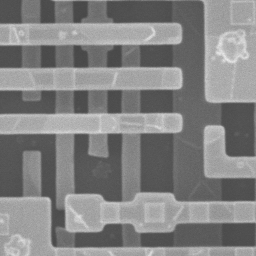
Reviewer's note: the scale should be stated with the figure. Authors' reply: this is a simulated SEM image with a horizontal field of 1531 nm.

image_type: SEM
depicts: wiring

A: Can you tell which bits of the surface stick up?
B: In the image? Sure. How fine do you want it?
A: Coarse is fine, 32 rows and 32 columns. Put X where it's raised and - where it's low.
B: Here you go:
-------------------------XXXXXXX
--------------------------XXXXXX
--------------------------XXXXXX
XXXXXXXXXXXXXXXXXXXXXXX---XXXXXX
XXXXXXXXXXXXXXXXXXXXXXX---XXXXXX
XXXXXXXXXXXXXXXXXXXX------XXXXXX
--------------------------XXXXXX
--------------------------XXXXXX
---------------XXXXXXX----XXXXXX
XXXXXXXXXXXXXXXXXXXXXXX---XXXXXX
XXXXXXXXXXXXXXXXXXXXXXX---XXXXXX
--------------------------XXXXXX
--------------------------XXXXXX
--------------------------------
XXXXXXXXXXXXXXXXXXXXXXX---------
XXXXXXXXXXXXXXXXXXXXXXX---------
XXXXXXXXXXXXXXXXXXXXXX----XX----
--------------------------XX----
--------------------------XX----
--------------------------XXX---
--------------------------XXXXXX
--------------------------XXXXXX
--------------------------------
--------------------------------
---------XXXX----XXXXX----------
XXXXXX--XXXXXXXXXXXXXXXXXXXXXXXX
XXXXXX--XXXXXXXXXXXXXXXXXXXXXXXX
XXXXXX--XXXXXXXXXXXXXXXXXXXXXXXX
XXXXXX--XXXXX----XXXXX----------
XXXXXX--------------------------
XXXXXXX-------------------------
XXXXXXXXXXXXXXXXXXXXXXXXXXXXXXXX